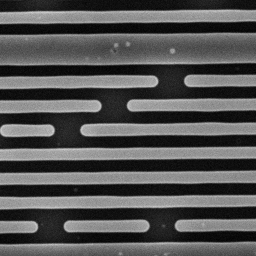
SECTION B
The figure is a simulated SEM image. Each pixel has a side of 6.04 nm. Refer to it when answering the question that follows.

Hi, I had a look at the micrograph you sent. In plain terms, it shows groups of lines, slits or small figures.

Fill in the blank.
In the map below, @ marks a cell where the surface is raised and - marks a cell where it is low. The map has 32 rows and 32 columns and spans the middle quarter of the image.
--------------------------------
--------------------------------
--------------------------------
@@@@@@@@@@@@@@@@@@@@@@@-------@@
@@@@@@@@@@@@@@@@@@@@@@@-------@@
@@@@@@@@@@@@@@@@@@@@@@@--------@
--------------------------------
--------------------------------
--------------------------------
@@@@@@@@@-------@@@@@@@@@@@@@@@@
@@@@@@@@@-------@@@@@@@@@@@@@@@@
@@@@@@@@@-------@@@@@@@@@@@@@@@@
--------------------------------
--------------------------------
--------------------------------
-----@@@@@@@@@@@@@@@@@@@@@@@@@@@
----@@@@@@@@@@@@@@@@@@@@@@@@@@@@
-----@@@@@@@@@@@@@@@@@@@@@@@@@@@
--------------------------------
--------------------------------
--------------------------------
@@@@@@@@@@@@@@@@@@@@@@@@@@@@@@@@
@@@@@@@@@@@@@@@@@@@@@@@@@@@@@@@@
@@@@@@@@@@@@@@@@@@@@@@@@@@@@----
--------------------------------
--------------------------------
--------------------------------
@@@@@@@@@@@@@@@@@@@@@@@@@@@@@@@@
@@@@@@@@@@@@@@@@@@@@@@@@@@@@@@@@
@@@@@@@@@@@@@@@@@@@@@@@@@@@@@@@@
--------------------------------
--------------------------------